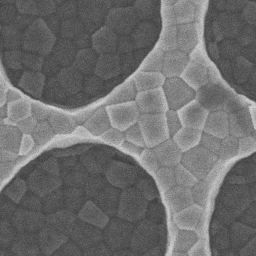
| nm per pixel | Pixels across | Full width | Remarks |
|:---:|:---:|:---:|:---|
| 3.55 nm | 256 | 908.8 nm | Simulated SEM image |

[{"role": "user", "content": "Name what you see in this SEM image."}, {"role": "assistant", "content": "holes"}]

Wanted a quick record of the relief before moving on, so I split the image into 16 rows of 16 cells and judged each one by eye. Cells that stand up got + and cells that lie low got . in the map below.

..........+++...
..........+++...
..........+++...
.........++++...
........++++++..
+......++++++++.
+++...++++++++++
++++++++++++++++
++++++++++++++++
+++.....++++++++
+........+++++..
..........++++..
..........+++...
..........+++...
..........+++...
..........+++...